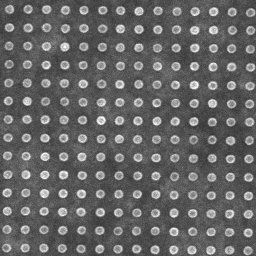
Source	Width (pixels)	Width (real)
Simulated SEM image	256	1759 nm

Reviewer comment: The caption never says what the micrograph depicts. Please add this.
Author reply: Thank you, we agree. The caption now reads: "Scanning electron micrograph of a regular array of raised bodies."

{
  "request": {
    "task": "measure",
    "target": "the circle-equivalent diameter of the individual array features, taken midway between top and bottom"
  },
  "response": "59.5 nm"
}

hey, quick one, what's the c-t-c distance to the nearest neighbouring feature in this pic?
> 123 nanometers